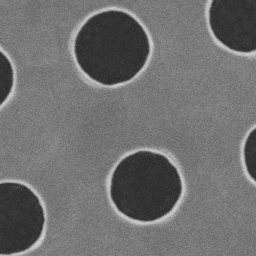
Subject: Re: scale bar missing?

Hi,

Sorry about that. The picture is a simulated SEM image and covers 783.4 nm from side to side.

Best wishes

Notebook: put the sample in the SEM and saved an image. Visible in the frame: holes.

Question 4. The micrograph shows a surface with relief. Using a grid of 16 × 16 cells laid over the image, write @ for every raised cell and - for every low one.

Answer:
@@@@@@@@@@@@@---
@@@@@----@@@@---
@@@@@----@@@@@--
@@@@@----@@@@@@@
-@@@@----@@@@@@@
-@@@@@@@@@@@@@@@
@@@@@@@@@@@@@@@@
@@@@@@@@@@@@@@@@
@@@@@@@@@@@@@@@@
@@@@@@@@@-@@@@@-
@@@@@@@----@@@@-
-@@@@@@----@@@@@
--@@@@@----@@@@@
---@@@@@--@@@@@@
---@@@@@@@@@@@@@
--@@@@@@@@@@@@@@